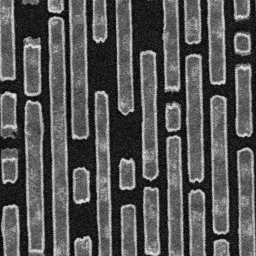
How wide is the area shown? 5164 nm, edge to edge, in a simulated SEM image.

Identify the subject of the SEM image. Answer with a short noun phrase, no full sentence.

parallel lines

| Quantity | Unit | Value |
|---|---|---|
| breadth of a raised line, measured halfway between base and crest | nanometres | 277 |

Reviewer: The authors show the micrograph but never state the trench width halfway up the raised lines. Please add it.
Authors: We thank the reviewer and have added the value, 204 nanometers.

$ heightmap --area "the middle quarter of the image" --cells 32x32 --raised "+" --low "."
..+++.........+++..++++..++++..+
..+++.........+++..++++..++++..+
..+++.........+++..++++..++++..+
..+++........++++..++++..++++..+
..+++.........+++..++++...+++..+
..+++.........+++...+++...+++..+
..+++.........+++...+++........+
..+++...++....+++...+++........+
..++++..+++...+++...+++........+
..++++..+++...+++...+++........+
..++++..+++...+++...+++........+
..++++..+++...+++...+++...+++..+
..++++..+++.........+++...+++..+
..++++..+++.........+++...+++..+
..++++..+++.........+++...+++..+
..++++..+++.........+++...+++..+
..++++..+++.........+++...++...+
..++++..+++.........+++........+
........+++.........+++....++..+
........+++.........+++...+++..+
........+++.........+++...+++..+
+.......+++.........+++...+++..+
+.......+++.........+++...+++..+
+.......+++.........+++...+++..+
+.......+++...+++...+++...+++..+
........+++...+++...+++...+++..+
...++...+++...+++...+++...+++..+
...+++..+++...+++...+++...+++...
+..+++...++...+++....++...+++...
+..+++...++...++++........+++...
+..+++...++...++++........+++...
+..+++...++.........+++...+++...